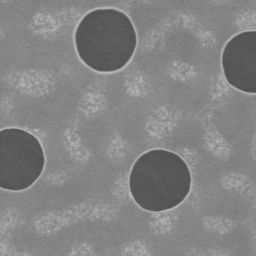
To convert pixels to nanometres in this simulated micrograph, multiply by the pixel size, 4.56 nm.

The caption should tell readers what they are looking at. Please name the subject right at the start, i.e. holes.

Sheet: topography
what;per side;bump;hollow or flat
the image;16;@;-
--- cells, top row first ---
@@@@@@@@@@@@@@@@
@@@@@---@@@@@@@@
@@@@@---@@@@@@--
@@@@@---@@@@@@--
@@@@@@@@@@@@@@--
@@@@@@@@@@@@@@@-
@@@@@@@@@@@@@@@@
@@@@@@@@@@@@@@@@
--@@@@@@@@@@@@@@
---@@@@@@--@@@@@
---@@@@@----@@@@
--@@@@@@----@@@@
@@@@@@@@---@@@@@
@@@@@@@@@@@@@@@@
@@@@@@@@@@@@@@@@
@@@@@@@@@@@@@@@@